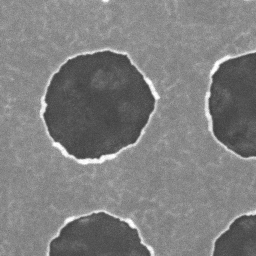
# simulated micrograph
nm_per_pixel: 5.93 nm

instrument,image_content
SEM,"holes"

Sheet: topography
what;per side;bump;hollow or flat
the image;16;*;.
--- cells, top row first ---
****************
****************
****************
*****...*******.
****.....****...
***......****...
***.......***...
***......****...
***......****...
****...********.
****************
****************
****************
*****..********.
****.....*****..
***......****...